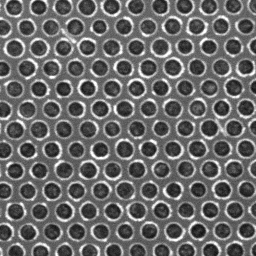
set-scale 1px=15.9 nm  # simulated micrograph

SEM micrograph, a regular array of holes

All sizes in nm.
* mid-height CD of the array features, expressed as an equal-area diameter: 261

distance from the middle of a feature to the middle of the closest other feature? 375 nanometers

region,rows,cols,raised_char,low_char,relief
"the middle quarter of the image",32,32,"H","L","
HLLLLHHLLLLHHLLLLHHLLLLHHLLLLHHL
HLLLLHHLLLLHHLLLLHHLLLLHHLLLLHHL
HHLLHHHHLLHHHHLLHHHHLLLHHHLLLHHH
HHHHHHHHHHHHHHHHHHHHHHHHHHHHHHHH
HHHHHLLHHHHLLHHHHLLHHHHLLHHHHLLH
LLHHLLLLHHLLLLHHLLLLHHLLLLHHLLLL
LLHHLLLLHHLLLLHHLLLLHHLLLLHHLLLL
LHHHHLLLHHLLLLHHHLLLHHHLLLHHHLLL
HHHHHHHHHHHHHHHHHHHHHHHHHHHHHHHH
HHLLHHHHLLHHHHLLHHHHLLHHHHLLLHHH
HLLLLHHLLLLHHLLLLHHLLLLHHLLLLHHL
HLLLLHHLLLLHHLLLLHHLLLLHHLLLLLHL
HLLLLHHHLLLHHHLLLHHHLLLHHHLLLHHH
HHHHHHHHHHHHHHHHHHHHHHHHHHHHHHHH
LHHHHLLHHHHLLHHHHLLHHHHLLHHHHLLL
LLHHLLLLHHLLLLHHLLLLHHLLLLHHLLLL
LLHHLLLLHHLLLLHHLLLLHHLLLLHHLLLL
LLHHLLLLHHHLLLHHHLLLHHHLLLHHHLLL
HHHHHHHHHHHHHHHHHHHHHHHHHHHHHHHH
HHHHHHHHHHHHHHLLHHHHHLHHHHLLHHHH
HLLLLHHLLLLHHLLLLHHLLLLHHLLLLHHL
HLLLLHHLLLLHHLLLLHHLLLLHHLLLLHHL
HLLLLHHLLLLHHLLLLHHHLLLHHHLLLHHH
HHHHHHHHHHHHHHHLHHHHHHHHHHHHHHHH
HHHHHHHHHHHHHHHHHHLHHHHHLHHHHLLL
LLHHLLLLHHLLLLHHLLLLHHHLLLHHLLLL
LLHHLLLLHHLLLLHHLLLLHHLLLLLHLLLL
LLHHLLLLHHLLLLHHLLLLHHHLLLHHHLLL
LHHHHHLHHHHHHHHHHHLHHHHHLHHHHHLH
HHHHHHHHHHHHHHHLHHHHHHHHHHHLHHHH
HLLLLHHLLLLHHLLLLHHHLLLHHHLLLHHH
HLLLLHHLLLLHHLLLLLHLLLLLHLLLLHHH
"